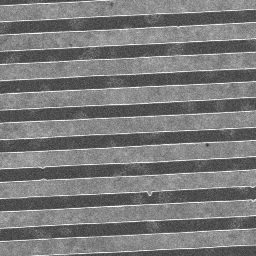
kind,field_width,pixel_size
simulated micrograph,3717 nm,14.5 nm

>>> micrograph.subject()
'parallel lines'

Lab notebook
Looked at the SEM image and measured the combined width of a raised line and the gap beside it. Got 428 nanometers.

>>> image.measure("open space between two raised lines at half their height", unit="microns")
0.227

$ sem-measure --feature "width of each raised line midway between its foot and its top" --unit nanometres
198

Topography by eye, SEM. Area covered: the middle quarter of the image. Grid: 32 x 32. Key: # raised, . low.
................................
................................
...................#############
################################
################################
#######################.........
###.............................
................................
................................
............................####
.....###########################
################################
################################
############....................
................................
................................
................................
..............##################
################################
################################
##################..............
................................
................................
................................
.........................#######
################################
################################
###########################.....
######..........................
................................
................................
.............................###